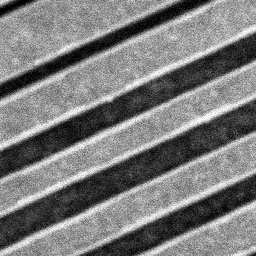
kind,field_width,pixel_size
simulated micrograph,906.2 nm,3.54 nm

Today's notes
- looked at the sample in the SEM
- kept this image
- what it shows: one or a few lines or trenches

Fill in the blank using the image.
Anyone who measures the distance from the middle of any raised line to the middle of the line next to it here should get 235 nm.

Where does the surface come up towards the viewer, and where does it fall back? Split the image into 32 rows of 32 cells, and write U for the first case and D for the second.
DDDDUUUUUUUUUUUUUUUUUDDDDDUUUUUU
DDUUUUUUUUUUUUUUUUUDDDDDUUUUUUUU
UUUUUUUUUUUUUUUUUDDDDDUUUUUUUUUU
UUUUUUUUUUUUUUDDDDDDUUUUUUUUUUUU
UUUUUUUUUUUUDDDDDDUUUUUUUUUUUUDD
UUUUUUUUUUDDDDDDUUUUUUUUUUUUDDDD
UUUUUUUUDDDDDUUUUUUUUUUUUUDDDDDD
UUUUUUDDDDDUUUUUUUUUUUUUDDDDDDDD
UUUUDDDDDUUUUUUUUUUUUDDDDDDDDDDU
UUDDDDDUUUUUUUUUUUUDDDDDDDDDUUUU
DDDDDUUUUUUUUUUUUDDDDDDDDDUUUUUU
DDDUUUUUUUUUUUUDDDDDDDDDUUUUUUUU
UUUUUUUUUUUUUDDDDDDDDDUUUUUUUUUD
UUUUUUUUUUUDDDDDDDDDUUUUUUUUUDDD
UUUUUUUUUDDDDDDDDDUUUUUUUUUDDDDD
UUUUUUDDDDDDDDDUUUUUUUUUDDDDDDDD
UUUUDDDDDDDDDUUUUUUUUUDDDDDDDDDD
UUDDDDDDDDDUUUUUUUUUDDDDDDDDDDUU
DDDDDDDDDUUUUUUUUUDDDDDDDDDDUUUU
DDDDDDDUUUUUUUUUDDDDDDDDDDUUUUUU
DDDDDUUUUUUUUUDDDDDDDDDDUUUUUUUU
DDDUUUUUUUUDDDDDDDDDDDUUUUUUUUUU
UUUUUUUUUDDDDDDDDDDDUUUUUUUUUUDD
UUUUUUUDDDDDDDDDDUUUUUUUUUUDDDDD
UUUUUDDDDDDDDDDUUUUUUUUUUDDDDDDD
UUUDDDDDDDDDDUUUUUUUUUUDDDDDDDDD
UDDDDDDDDDDUUUUUUUUUUDDDDDDDDUUU
DDDDDDDDDUUUUUUUUUUDDDDDDDDDUUUU
DDDDDDDUUUUUUUUUUDDDDDDDDUUUUUUU
DDDDUUUUUUUUUUUDDDDDDDDUUUUUUUUU
DDUUUUUUUUUUDDDDDDDDDUUUUUUUUUUU
UUUUUUUUUUDDDDDDDDDUUUUUUUUUUUUD